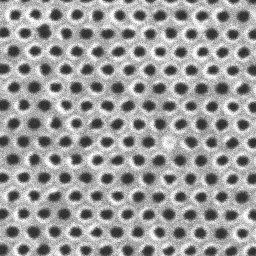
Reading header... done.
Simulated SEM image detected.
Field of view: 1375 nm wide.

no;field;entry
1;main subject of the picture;a regular array of holes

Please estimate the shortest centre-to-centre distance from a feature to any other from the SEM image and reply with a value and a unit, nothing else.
110 nanometres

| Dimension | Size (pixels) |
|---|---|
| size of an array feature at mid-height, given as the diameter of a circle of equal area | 12.1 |